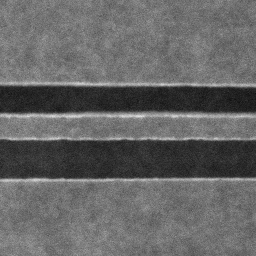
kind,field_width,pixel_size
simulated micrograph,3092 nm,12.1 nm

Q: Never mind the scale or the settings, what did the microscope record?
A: lines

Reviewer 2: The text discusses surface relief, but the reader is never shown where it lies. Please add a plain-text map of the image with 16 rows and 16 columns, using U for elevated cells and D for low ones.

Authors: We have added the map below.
UUUUUUUUUUUUUUUU
UUUUUUUUUUUUUUUU
UUUUUUUUUUUUUUUU
UUUUUUUUUUUUUUUU
UUUUUUUUUUUUUUUU
DDDDDDDDDDDDDDDD
DDDDDDDDDDDDDDDD
UUUUUUUUUUUUUUUU
UUUUUUUUUUUUUUUU
DDDDDDDDDDDDDDDD
DDDDDDDDDDDDDDDD
UUUUUUUUUUUUUUUU
UUUUUUUUUUUUUUUU
UUUUUUUUUUUUUUUU
UUUUUUUUUUUUUUUU
UUUUUUUUUUUUUUUU